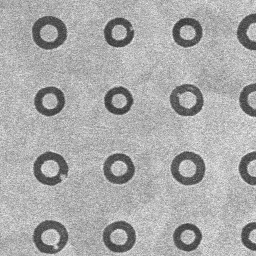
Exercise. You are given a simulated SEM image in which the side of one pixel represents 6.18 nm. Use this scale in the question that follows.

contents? a regular array of ring-shaped grooves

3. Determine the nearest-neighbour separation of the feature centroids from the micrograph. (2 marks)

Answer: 420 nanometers